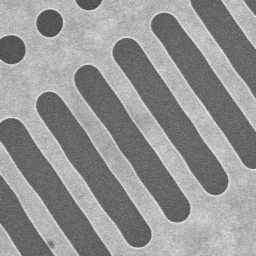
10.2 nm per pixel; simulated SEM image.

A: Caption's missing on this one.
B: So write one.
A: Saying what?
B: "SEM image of groups of lines, slits or small figures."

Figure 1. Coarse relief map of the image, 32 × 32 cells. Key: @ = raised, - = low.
@@@@@@@@@@---@@@@@@@@@@@----@@@-
@@@@@--@@@@@@@@@@@@@@@@@-----@@-
@@@@@---@@@@@@@@@@@---@@@----@@@
@@@@@---@@@@@@@@@@@----@@@----@@
@-@@@@-@@@@@@@@@@@@-----@@@----@
---@@@@@@@@@@@---@@@----@@@-----
---@@@@@@@@@@@----@@@----@@@----
---@@@@@@@@@@@-----@@@----@@@---
@@@@@@@@@@--@@@----@@@----@@@---
@@@@@@@@@----@@@----@@@----@@@--
@@@@@@@@@-----@@-----@@-----@@@-
@@@@@@-@@@----@@@----@@@-----@@-
@@@@@---@@@----@@@----@@@----@@@
@@@@@----@@-----@@-----@@@----@@
@@@@@----@@@----@@@----@@@-----@
---@@@----@@@----@@@----@@@----@
----@@-----@@@----@@-----@@@----
----@@@----@@@----@@@----@@@----
@----@@@----@@@----@@@----@@@---
@-----@@-----@@-----@@@----@@@--
@@----@@@----@@@----@@@-----@@--
@@@----@@@----@@@----@@@----@@@@
-@@-----@@@----@@-----@@@----@@@
-@@@----@@@----@@@----@@@---@@@@
--@@@----@@@----@@@----@@@@@@@@@
---@@@----@@-----@@@----@@@@@@@@
---@@@----@@@----@@@----@@@@@@@@
----@@@----@@@----@@@--@@@@@@@@@
----@@@@----@@@----@@@@@@@@@@@@@
@----@@@----@@@----@@@@@@@@@@@@@
@@----@@@----@@@--@@@@@@@@@@@@@@
@@-----@@@----@@@@@@@@@@@@@@@@@@